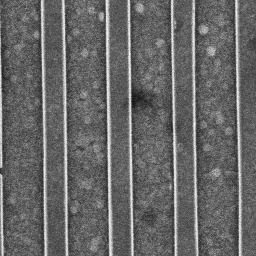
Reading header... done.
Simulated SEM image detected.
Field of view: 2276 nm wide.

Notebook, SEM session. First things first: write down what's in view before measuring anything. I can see one or a few lines or trenches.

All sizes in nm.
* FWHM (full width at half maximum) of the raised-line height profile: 196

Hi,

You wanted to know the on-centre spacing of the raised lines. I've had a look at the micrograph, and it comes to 577 nm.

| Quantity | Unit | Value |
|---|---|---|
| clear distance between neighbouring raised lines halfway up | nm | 375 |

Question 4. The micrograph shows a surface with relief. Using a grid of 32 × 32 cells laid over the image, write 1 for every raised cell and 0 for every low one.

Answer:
00000111000001110000011100000011
00000111000001110000001100000011
00000111000001110000001100000011
00000111000001110000001100000011
00000111000001110000001100000011
00000111000001110000001100000011
00000111000001110000001100000011
00000111000001110000001100000011
00000111000001110000001100000011
00000111000001110000001100000011
00000111000001110000001100000011
00000111000001110000001100000011
00000111000000110000001100000011
00000111000000110000001100000011
00000011000000110000001100000011
00000011000000110000001100000011
00000011000000110000001100000011
00000011000000110000001100000011
00000011000000110000001100000011
00000011000000110000001100000011
00000011000000110000001100000011
00000011000000110000001100000011
00000011000000110000001100000011
00000011000000110000001100000011
00000011000000110000001100000011
00000011000000110000001100000011
00000011000000110000001110000011
00000011000000110000001110000011
00000011000000111000001110000011
00000011000000111000001110000011
00000011000000111000001110000011
00000011000000111000001110000011